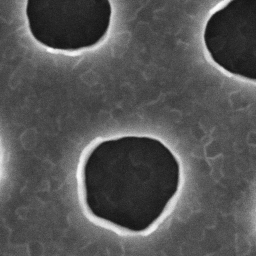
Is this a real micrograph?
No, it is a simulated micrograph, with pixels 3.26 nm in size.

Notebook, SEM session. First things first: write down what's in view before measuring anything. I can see holes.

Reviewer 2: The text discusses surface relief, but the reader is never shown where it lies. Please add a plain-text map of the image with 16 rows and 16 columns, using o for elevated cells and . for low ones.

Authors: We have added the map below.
oo.....ooooooo..
oo.....oooooo...
oo....ooooooo...
ooooooooooooo...
oooooooooooooo..
oooooooooooooooo
oooooooooooooooo
oooooooooooooooo
oooooooooooooooo
oooooo.....ooooo
ooooo......ooooo
ooooo......ooooo
ooooo......ooooo
oooooo....oooooo
oooooooooooooooo
oooooooooooooooo